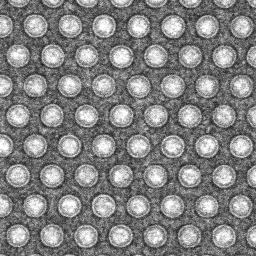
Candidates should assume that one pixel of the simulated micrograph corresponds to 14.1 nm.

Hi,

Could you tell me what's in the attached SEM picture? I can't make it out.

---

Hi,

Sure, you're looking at a regular array of holes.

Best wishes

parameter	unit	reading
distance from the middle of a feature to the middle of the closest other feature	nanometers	480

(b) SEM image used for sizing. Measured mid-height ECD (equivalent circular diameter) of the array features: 296 nanometers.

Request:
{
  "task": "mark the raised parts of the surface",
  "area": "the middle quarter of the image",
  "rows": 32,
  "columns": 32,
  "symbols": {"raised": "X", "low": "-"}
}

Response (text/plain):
XXXXX-XXXXXXX---XXXXXX--XXXXXXX-
XXXXXXXXXXXXXXXXXXXXXXXXXXXXXXXX
XXXXXXXXXXXXXXXXXXXXXXXXXXXXXXXX
---XXXXX----XXXXX---XXXXX----XXX
----XXX-----XXXX-----XXXX-----XX
----XXX------XXX-----XXX------XX
----XXX------XXX-----XXXX-----XX
---XXXXX----XXXXX----XXXX----XXX
XXXXXXXXXXXXXXXXXXXXXXXXXXXXXXXX
XXXXXXXXXXXXXXXXXXXXXXXXXXXXXXXX
XXXXX-XXXXXXXX-XXXXXXX--XXXXXXX-
XXXX----XXXX-----XXXX----XXXX---
XXX-----XXXX-----XXX------XXX---
XXX-----XXXX-----XXX------XXX---
XXX-----XXXX-----XXXX----XXXX---
XXXXX-XXXXXXX--XXXXXXX--XXXXXX--
XXXXXXXXXXXXXXXXXXXXXXXXXXXXXXXX
XXXXXXXXXXXXXXXXXXXXXXXXXXXXXXXX
---XXXXX----XXXXX---XXXXX----XXX
----XXX------XXX-----XXXX-----XX
----XXX------XXX------XX------XX
----XXX------XXX-----XXXX-----XX
---XXXXX----XXXXX----XXXX----XXX
XXXXXXXXXXXXXXXXXXXXXXXXXXXXXXXX
XXXXXXXXXXXXXXXXXXXXXXXXXXXXXXXX
XXXX---XXXXXX--XXXXXXXXXXXXXXXX-
XXX-----XXXX-----XXXX----XXXX---
XXX-----XXXX-----XXX------XXX---
XXX-----XXXX-----XXX------XXX---
XXX-----XXXX----XXXXX----XXXX---
XXXXX-XXXXXXX--XXXXXXX--XXXXXXX-
XXXXXXXXXXXXXXXXXXXXXXXXXXXXXXXX